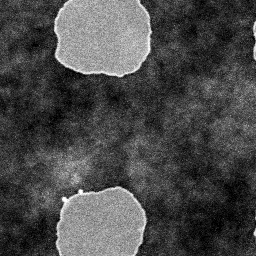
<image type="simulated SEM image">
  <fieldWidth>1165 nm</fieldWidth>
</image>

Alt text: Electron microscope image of raised bodies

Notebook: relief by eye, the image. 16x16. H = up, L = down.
LLLLHHHHHLLLLLLL
LLLHHHHHHLLLLLLL
LLLLHHHHHLLLLLLL
LLLLHHHHHLLLLLLL
LLLLLHHHLLLLLLLL
LLLLLLLLLLLLLLLL
LLLLLLLLLLLLLLLL
LLLLLLLLLLLLLLLL
LLLLLLLLLLLLLLLL
LLLLLLLLLLLLLLLL
LLLLLLLLLLLLLLLL
LLLLLLLLLLLLLLLL
LLLLHHHHHLLLLLLL
LLLLHHHHHLLLLLLL
LLLLHHHHHLLLLLLL
LLLLHHHHHLLLLLLL